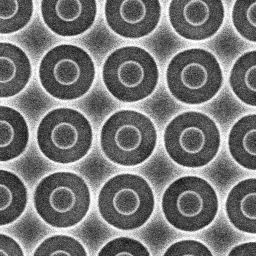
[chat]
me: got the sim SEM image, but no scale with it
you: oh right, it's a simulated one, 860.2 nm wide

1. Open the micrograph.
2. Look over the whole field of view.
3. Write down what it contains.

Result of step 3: an array of small figures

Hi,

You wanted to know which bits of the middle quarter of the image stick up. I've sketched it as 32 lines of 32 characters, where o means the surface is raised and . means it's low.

ooo.....oo....ooooo....ooo.....o
oooo....oo....oooooo....oo....oo
oooo....o.....oooooo....o....ooo
ooo.....oo....oooooo....o....ooo
oo.....ooo....ooooo.....o.....oo
.......ooo.......o.....ooo.....o
......ooooo............ooo......
.....ooooooo..........ooooo.....
....ooooooooo.......oooooooo....
oooooooooooooo...oooooooooooo...
oooooooooooooooooooooooooooooooo
...ooooooooooo...ooooooooooooooo
.....ooooooo........ooooooooo...
......ooooo..........oooooo.....
......oooo............oooo......
oo.....oo......oo......ooo......
ooo....oo.....oooo.....oo.....oo
ooo....oo....oooooo....oo....ooo
ooo....oo....oooooo....oo....ooo
ooo....oo....oooooo....oo....ooo
oo.....oo.....oooo.....oo....ooo
......ooo......oo......oo.....oo
......oooo............oooo......
.....oooooo..........oooooo.....
...ooooooooo........oooooooo....
ooooooooooooooo...oooooooooooo..
oooooooooooooooooooooooooooooooo
...ooooooooooo....oooooooooooooo
....oooooooo........ooooooooo...
......ooooo..........oooooo.....
......oooo............oooo......
oo....ooo......oo.....ooo.......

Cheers